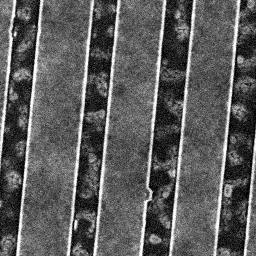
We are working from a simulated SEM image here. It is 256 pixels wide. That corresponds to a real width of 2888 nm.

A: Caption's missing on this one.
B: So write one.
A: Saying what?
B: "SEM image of one or a few lines or trenches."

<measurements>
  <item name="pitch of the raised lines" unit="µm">0.841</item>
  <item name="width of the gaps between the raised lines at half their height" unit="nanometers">295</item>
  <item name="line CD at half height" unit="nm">517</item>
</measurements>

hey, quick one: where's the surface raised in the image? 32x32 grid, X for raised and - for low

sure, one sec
XX---XXXXXXX---XXXXXX---XXXXXX--
XX---XXXXXX----XXXXX----XXXXXX--
XX---XXXXXX----XXXXX----XXXXXX--
X----XXXXXX----XXXXX----XXXXXX--
X----XXXXXX---XXXXXX----XXXXX---
X----XXXXXX---XXXXXX----XXXXX---
X----XXXXXX---XXXXXX----XXXXX---
X---XXXXXXX---XXXXXX----XXXXX---
X---XXXXXXX---XXXXXX----XXXXX---
X---XXXXXXX---XXXXXX---XXXXXX---
X---XXXXXXX---XXXXXX---XXXXXX---
X---XXXXXX----XXXXXX---XXXXXX---
X---XXXXXX----XXXXX----XXXXXX---
X---XXXXXX----XXXXX----XXXXXX---
X---XXXXXX----XXXXX----XXXXXX---
----XXXXXX---XXXXXX----XXXXX----
----XXXXXX---XXXXXX----XXXXX----
----XXXXXX---XXXXXX----XXXXX----
---XXXXXXX---XXXXXX----XXXXX----
---XXXXXXX---XXXXXX----XXXXX----
---XXXXXXX---XXXXXX---XXXXXX----
---XXXXXXX---XXXXXX---XXXXXX----
---XXXXXX----XXXXX----XXXXXX---X
---XXXXXX----XXXXXX---XXXXXX---X
---XXXXXX----XXXXXX---XXXXXX---X
---XXXXXX---XXXXXX----XXXXX----X
---XXXXXX---XXXXXX----XXXXX----X
---XXXXXX---XXXXXX----XXXXX----X
--XXXXXXX---XXXXXX----XXXXX----X
--XXXXXXX---XXXXXX---XXXXXX----X
--XXXXXXX---XXXXXX---XXXXXX----X
--XXXXXXX---XXXXXX---XXXXXX----X